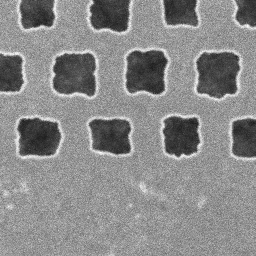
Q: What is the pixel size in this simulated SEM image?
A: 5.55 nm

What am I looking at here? holes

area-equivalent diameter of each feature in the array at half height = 249 nm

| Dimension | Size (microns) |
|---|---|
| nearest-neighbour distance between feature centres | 0.396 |